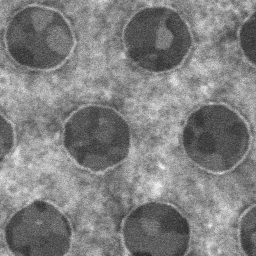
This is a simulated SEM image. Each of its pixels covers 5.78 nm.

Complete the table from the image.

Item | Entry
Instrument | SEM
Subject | raised bodies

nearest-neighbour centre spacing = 666 nm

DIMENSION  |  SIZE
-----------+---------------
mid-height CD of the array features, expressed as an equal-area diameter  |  393 nm